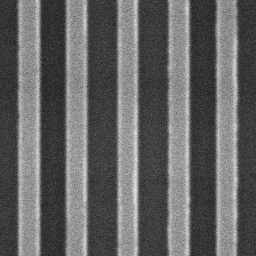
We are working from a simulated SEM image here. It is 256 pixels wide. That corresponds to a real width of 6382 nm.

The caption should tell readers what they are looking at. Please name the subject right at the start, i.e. lines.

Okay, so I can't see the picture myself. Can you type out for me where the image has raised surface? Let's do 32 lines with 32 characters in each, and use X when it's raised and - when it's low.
--XXX---XXX----XX----XX----XX---
--XXX---XXX----XX----XX----XX---
--XXX---XXX----XX----XX----XX---
--XXX---XXX----XX----XX----XX---
--XXX---XXX----XX----XX----XX---
--XXX---XXX----XX----XXX---XX---
--XXX---XXX----XX----XX----XX---
--XXX---XXX----XX----XX----XX---
--XXX---XXX----XX----XX----XX---
--XXX---XXX----XX----XX----XX---
--XXX---XXX----XX----XX----XX---
--XXX---XXX----XX----XX----XX---
--XXX---XXX----XX----XX----XX---
--XXX---XXX----XX----XX----XX---
---XX---XXX----XX----XX----XX---
--XXX---XXX----XX----XX----XX---
--XXX---XXX----XX----XX----XX---
--XXX---XXX----XX----XX----XX---
--XXX---XXX----XX----XX----XX---
--XXX---XXX----XX----XX----XX---
--XXX---XXX----XX----XX----XX---
--XXX---XXX----XX----XX----XX---
--XXX---XXX----XX----XX----XX---
--XXX---XXX----XX----XX----XX---
--XXX---XXX----XX----XX----XX---
--XXX---XXX----XX----XX----XX---
--XXX---XXX----XX----XX----XX---
--XXX---XXX----XX----XX----XX---
--XXX---XXX----XX----XX----XX---
--XXX---XXX----XX----XX----XX---
--XXX---XXX----XX----XX----XX---
--XXX---XXX----XX----XX----XX---